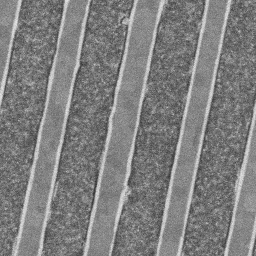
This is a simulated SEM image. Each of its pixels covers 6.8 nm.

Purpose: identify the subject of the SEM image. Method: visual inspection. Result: one or a few lines or trenches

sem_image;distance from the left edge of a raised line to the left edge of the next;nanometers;469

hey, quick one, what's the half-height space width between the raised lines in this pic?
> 307 nm